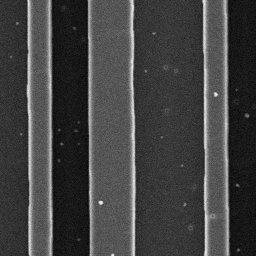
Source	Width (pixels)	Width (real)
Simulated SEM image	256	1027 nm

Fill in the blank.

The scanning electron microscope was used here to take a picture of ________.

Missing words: lines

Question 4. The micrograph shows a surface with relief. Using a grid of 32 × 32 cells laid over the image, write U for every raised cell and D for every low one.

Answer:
DDDDUUDDDDDUUUUUUDDDDDDDDUUUDDDD
DDDDUUDDDDDUUUUUUDDDDDDDDUUUDDDD
DDDDUUDDDDDUUUUUDDDDDDDDDUUUDDDD
DDDDUUDDDDDUUUUUDDDDDDDDDUUUDDDD
DDDDUUDDDDDUUUUUUDDDDDDDDUUUDDDD
DDDDUUDDDDDUUUUUUDDDDDDDDUUUDDDD
DDDDUUDDDDDUUUUUUDDDDDDDDDUUDDDD
DDDDUUDDDDDUUUUUUDDDDDDDDDUUDDDD
DDDDUUDDDDDUUUUUUDDDDDDDDDUUDDDD
DDDDUUDDDDDUUUUUDDDDDDDDDDUUDDDD
DDDDUUDDDDDUUUUUUDDDDDDDDDUUDDDD
DDDDUUDDDDDUUUUUUDDDDDDDDDUUDDDD
DDDDUUDDDDDUUUUUUDDDDDDDDDUUDDDD
DDDDUUDDDDDUUUUUUDDDDDDDDDUUDDDD
DDDDUUDDDDDUUUUUUDDDDDDDDDUUDDDD
DDDDUUDDDDDUUUUUUDDDDDDDDDUUDDDD
DDDDUUDDDDDUUUUUUDDDDDDDDDUUDDDD
DDDDUUDDDDDUUUUUUDDDDDDDDDUUDDDD
DDDDUUDDDDDUUUUUUDDDDDDDDDUUDDDD
DDDDUUDDDDDUUUUUUDDDDDDDDDUUDDDD
DDDDUUDDDDDUUUUUUDDDDDDDDDUUDDDD
DDDDUUDDDDDUUUUUUDDDDDDDDDUUDDDD
DDDDUUDDDDDUUUUUUDDDDDDDDDUUDDDD
DDDDUUDDDDDUUUUUUDDDDDDDDDUUDDDD
DDDDUUDDDDDUUUUUUDDDDDDDDDUUDDDD
DDDDUUDDDDDUUUUUUDDDDDDDDDUUDDDD
DDDDUUDDDDDUUUUUUDDDDDDDDDUUDDDD
DDDDUUDDDDDUUUUUUDDDDDDDDDUUDDDD
DDDDUUDDDDDUUUUUUDDDDDDDDDUUDDDD
DDDDUUDDDDDUUUUUUDDDDDDDDDUUDDDD
DDDDUUDDDDDUUUUUUDDDDDDDDDUUDDDD
DDDDUUDDDDDUUUUUUDDDDDDDDDUUDDDD